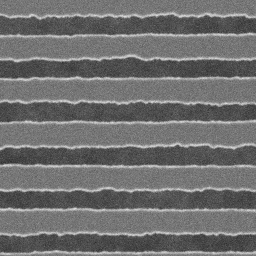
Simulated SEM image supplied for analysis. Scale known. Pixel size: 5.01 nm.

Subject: lines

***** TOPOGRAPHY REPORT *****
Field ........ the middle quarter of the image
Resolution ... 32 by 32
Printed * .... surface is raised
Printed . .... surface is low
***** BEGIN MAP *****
................................
................................
................................
..***..**.**....**......*****...
********************************
********************************
********************************
********************************
********************************
.***..************..************
................................
................................
................................
................................
.****.....................**.***
********************************
********************************
********************************
********************************
********************************
****************..********....*.
................................
................................
................................
................................
***********.*.*..*.*****......**
********************************
********************************
********************************
********************************
********************************
***.*****....************.*..***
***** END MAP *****